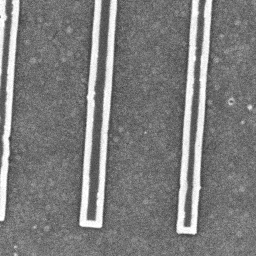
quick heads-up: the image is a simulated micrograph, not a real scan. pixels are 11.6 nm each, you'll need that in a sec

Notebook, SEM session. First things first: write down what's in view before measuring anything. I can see one or a few lines or trenches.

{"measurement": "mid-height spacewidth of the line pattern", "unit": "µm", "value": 0.93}